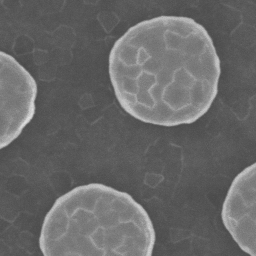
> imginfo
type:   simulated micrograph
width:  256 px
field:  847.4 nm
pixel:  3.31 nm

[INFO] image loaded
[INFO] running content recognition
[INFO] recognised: raised bodies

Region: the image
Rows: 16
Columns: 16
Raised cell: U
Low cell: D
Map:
DDDDDDDDDDDDDDDD
DDDDDDDDDUUUDDDD
DDDDDDDDUUUUUDDD
UDDDDDDUUUUUUUDD
UUDDDDDUUUUUUUDD
UUDDDDDUUUUUUDDD
UUDDDDDDUUUUUDDD
UUDDDDDDDUUUDDDD
UDDDDDDDDDDDDDDD
DDDDDDDDDDDDDDDD
DDDDDDDDDDDDDDDD
DDDDDDDDDDDDDDDU
DDDDUUUUDDDDDDUU
DDDUUUUUUDDDDDUU
DDDUUUUUUUDDDDUU
DDDUUUUUUDDDDDDU